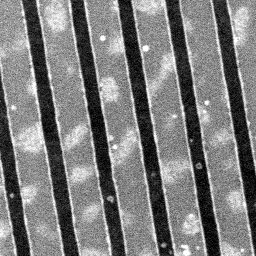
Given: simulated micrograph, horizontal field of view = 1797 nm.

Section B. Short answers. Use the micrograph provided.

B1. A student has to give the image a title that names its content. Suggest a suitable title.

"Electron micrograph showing parallel lines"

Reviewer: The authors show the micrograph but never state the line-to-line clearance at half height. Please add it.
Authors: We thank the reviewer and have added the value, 218 nm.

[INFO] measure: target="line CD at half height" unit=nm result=112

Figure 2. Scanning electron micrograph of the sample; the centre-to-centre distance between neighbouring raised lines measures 330 nanometres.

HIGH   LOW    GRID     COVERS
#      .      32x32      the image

...##....##....##....##...##....
...##....##....##....##....##.#.
...##....##....##....##....##...
...##..#.##....##....##....##...
...##....##....##....##....##...
....##...##....##....##....##...
....##....##....##....##...##...
....##....##....##....##....##..
....##....##....##....##....##..
....##....##....##....##....##..
....##....##....##....##....##..
#....##....#....##....##....##..
#....##....##....##....##....##.
#....##....##....##....##....##.
#....##....##....##....##....##.
#....##....##....##....##....##.
#....##....##....##....##....##.
##...###....##...##....##....##.
##....##....##....##....#.....##
##....##....##....##....##....##
##....##....##....##....##....##
##....##....##....##....##....##
##....##....##....##....##....##
.##...###...##....##....##....##
.##....##....##....##....#....##
.##....##....##....##....##....#
.##....##....##....##....##....#
.##....##....##....##....##....#
.##....##....##....##....##....#
..##....##....##...##....##....#
..##....##....##....##....##...#
..##....##....##....##....##....